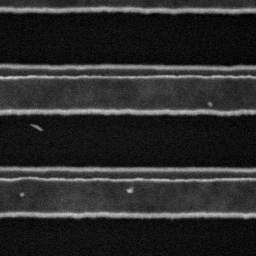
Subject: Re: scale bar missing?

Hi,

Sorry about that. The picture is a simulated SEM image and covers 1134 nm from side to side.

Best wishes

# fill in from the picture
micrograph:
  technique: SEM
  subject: lines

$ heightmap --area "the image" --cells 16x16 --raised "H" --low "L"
HHHHHHHHHHHHHHHH
LLLLLLLLLLLLLLLL
LLLLLLLLLLLLLLLL
LLLLLLLLLLLLLLLL
HHHHHHHHHHHHHHHH
HHHHHHHHHHHHHHHH
HHHHHHHHHHHHHHHH
LLLLLLLLLLLLLLLL
LLLLLLLLLLLLLLLL
LLLLLLLLLLLLLLLL
LLLLLLLLLLLLLLLL
HHHHHHHHHHHHHHHH
HHHHHHHHHHHHHHHH
LLLLLLLLLLLLLLLL
LLLLLLLLLLLLLLLL
LLLLLLLLLLLLLLLL